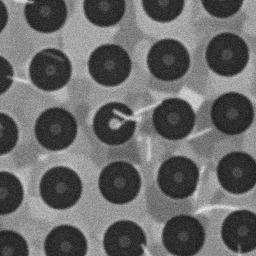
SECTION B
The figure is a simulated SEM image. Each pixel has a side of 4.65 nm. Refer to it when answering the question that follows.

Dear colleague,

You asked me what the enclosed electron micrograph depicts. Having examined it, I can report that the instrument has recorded an array of small figures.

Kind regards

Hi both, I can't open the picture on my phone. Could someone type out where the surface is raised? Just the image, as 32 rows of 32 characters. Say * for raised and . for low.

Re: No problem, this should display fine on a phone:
.**.....**......**.....**.....**
.**.....**......**.....***....**
.**.....***....****...**********
.***....************************
***************************...**
*************.*****....***.....*
*****...****....**......**.....*
.***.....**.....**......**.....*
..*......**.....**......**.....*
..**.....**.....***....*****.***
..**....****...*****************
.*******************************
********************...****....*
******..****....***.....**......
.****....***....***.....**......
..**......*......**.....***....*
..**......**.....***....****..**
..***....***....*****..*********
..***...************************
**********************.*****...*
*************...****....***.....
.*****....***....***.....**.....
...**.....**......**.....**.....
...**.....**......**.....***....
...**.....***....****...********
...***...*****..****************
..***************************...
***************.*****....***....
*******...***.....**.....***....
...***.....**.....**......**....
...**......**.....**.....***....
....*......**.....***....****..*